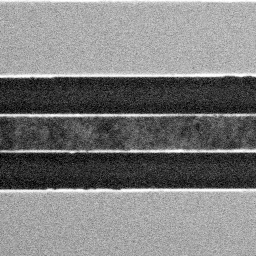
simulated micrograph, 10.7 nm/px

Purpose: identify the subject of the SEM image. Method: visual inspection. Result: lines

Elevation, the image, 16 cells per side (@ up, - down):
@@@@@@@@@@@@@@@@
@@@@@@@@@@@@@@@@
@@@@@@@@@@@@@@@@
@@@@@@@@@@@@@@@@
@@@@@@@@@@@@@@@@
----------------
----------------
@@@@@@@@@@@@@@@@
@@@@@@@@@@@@@@@@
----------------
----------------
----------------
@@@@@@@@@@@@@@@@
@@@@@@@@@@@@@@@@
@@@@@@@@@@@@@@@@
@@@@@@@@@@@@@@@@